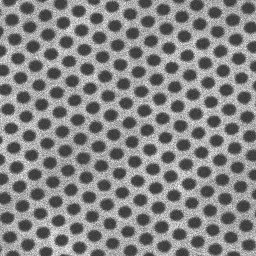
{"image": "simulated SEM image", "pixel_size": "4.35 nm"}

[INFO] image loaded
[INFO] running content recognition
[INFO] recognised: a regular array of holes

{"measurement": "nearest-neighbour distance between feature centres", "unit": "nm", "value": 83.6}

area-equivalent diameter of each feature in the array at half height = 55.8 nanometres